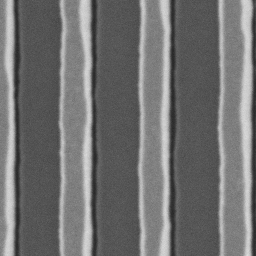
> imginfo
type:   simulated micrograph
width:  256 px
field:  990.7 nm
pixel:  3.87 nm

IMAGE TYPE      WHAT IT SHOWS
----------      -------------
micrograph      lines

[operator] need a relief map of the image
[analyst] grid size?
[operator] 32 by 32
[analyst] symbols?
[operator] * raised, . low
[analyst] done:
**......***.......***......****.
**......***.......***......****.
**......***.......***......****.
**......***.......***.......***.
**......***.......***.......***.
**......***......****.......***.
**......***......****.......***.
*.......***......****.......***.
**......***......****.......***.
**......***......****.......***.
**......***......****.......***.
**......***......****.......***.
**......***......****.......***.
**......***.......***......****.
**......***.......***......****.
**.....****.......***......****.
**......***.......***......****.
**......***.......***......****.
**......***......****.......***.
**......***......****.......***.
**......***......****.......***.
**......***......****.......***.
**......***......****.......***.
**......***......****.......***.
**......***......****.......***.
**......***......****.......***.
**......***......****.......***.
**......***......****.......***.
**.....****.......***.......***.
**.....****.......***.......***.
**......***.......***.......***.
**......***.......***.......***.